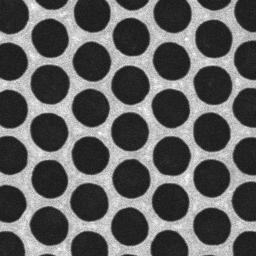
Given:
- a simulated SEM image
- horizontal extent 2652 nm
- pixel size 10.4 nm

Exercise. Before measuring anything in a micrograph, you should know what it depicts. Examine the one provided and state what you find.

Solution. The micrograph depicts a regular array of holes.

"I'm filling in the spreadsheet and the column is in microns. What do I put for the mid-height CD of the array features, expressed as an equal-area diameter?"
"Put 0.403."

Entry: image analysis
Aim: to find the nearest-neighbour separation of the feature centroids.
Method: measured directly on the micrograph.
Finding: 478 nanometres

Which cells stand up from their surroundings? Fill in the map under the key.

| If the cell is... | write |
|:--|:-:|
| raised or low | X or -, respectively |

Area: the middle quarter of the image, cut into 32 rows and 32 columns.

XX----------XXX---XXXX----------
XXX--------XX-------XXX--------X
-XX--------XX-------XXX--------X
-XXX------XX---------XXX------XX
--XXXXX-XXXX---------XXXXXXXXXXX
--XXXXXXXXXX----------XXXXXXXXXX
-XXXX---XXXX---------XXXX---XXXX
-XX-------XX---------XX-------XX
XX---------XX-------XX---------X
XX---------XXX-----XXX---------X
XX---------XXXXXXXXXXX---------X
XX----------XXXXXXXXXX----------
XX---------XXX----XXXX---------X
XXX--------XX-------XXX--------X
XXXX------XX---------XXX------XX
-XXXX----XXX---------XXXX----XXX
-XXXXXXXXXXX---------XXXXXXXXXXX
-XXXXXXXXXXX---------XXXXXXXXXXX
-XXX----XXXX---------XXXX----XXX
XXX-------XX---------XXX------XX
XX--------XXX-------XXX--------X
XX---------XXXX----XXX----------
XX----------XXXXXXXXXX----------
XX---------XXXXXXXXXXX----------
XX---------XXX-----XXX---------X
XXX--------XX-------XXX--------X
XXX-------XXX--------XX--------X
-XXXX---XXXX----------XX------XX
-XXXXXXXXXXX----------XXXXXXXXXX
-XXXXXXXXXXX----------XXXXXXXXXX
-XXX-----XXX----------XX-----XXX
XXX-------XXX--------XX-------XX